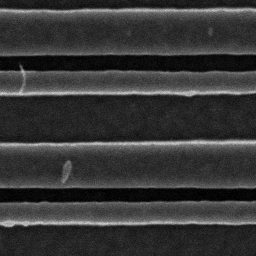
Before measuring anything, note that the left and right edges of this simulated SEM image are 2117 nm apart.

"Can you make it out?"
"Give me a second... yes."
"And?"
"lines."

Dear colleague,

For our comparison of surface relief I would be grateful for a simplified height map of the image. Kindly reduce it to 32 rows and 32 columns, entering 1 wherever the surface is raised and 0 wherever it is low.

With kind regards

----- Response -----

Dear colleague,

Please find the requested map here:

00000000000000000000000000000000
11111111111111111111111111111111
11111111111111111111111111111111
11111111111111111111111111111111
11111111111111111111111111111111
11111111111111111111111111111111
11111111111111111111111111111111
00000000000000000000000000000000
00000000000000000000000000000000
11111111111111111111111111111111
11111111111111111111111111111111
11111111111111111111111111111111
00000000000000000000000000000000
00000000000000000000000000000000
00000000000000000000000000000000
00000000000000000000000000000000
00000000000000000000000000000000
00000000000000000000000000000000
11111111111111111111111111111111
11111111111111111111111111111111
11111111111111111111111111111111
11111111111111111111111111111111
11111111111111111111111111111111
00000000000000000000000000000000
00000000000000000000000000000000
11111111111111111111111111111111
11111111111111111111111111111111
11111111111111111111111111111111
00000000000000000000000000000000
00000000000000000000000000000000
00000000000000000000000000000000
00000000000000000000000000000000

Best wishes